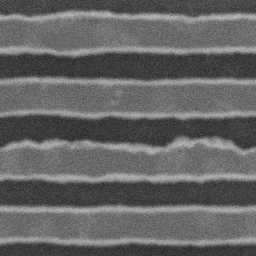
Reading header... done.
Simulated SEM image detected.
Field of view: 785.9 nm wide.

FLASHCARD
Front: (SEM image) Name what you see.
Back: one or a few lines or trenches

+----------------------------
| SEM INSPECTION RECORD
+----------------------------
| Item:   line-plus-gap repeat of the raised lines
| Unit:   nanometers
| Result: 196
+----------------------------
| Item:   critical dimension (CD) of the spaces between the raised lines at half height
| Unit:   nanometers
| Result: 88.7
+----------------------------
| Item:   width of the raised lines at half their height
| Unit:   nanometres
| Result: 108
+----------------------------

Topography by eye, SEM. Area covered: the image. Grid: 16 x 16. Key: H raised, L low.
LLLLLLLLLLLLLLLL
HHHHHHHHHHHHHHHH
HHHHHHHHHHHHHHHH
LLLLLLLLLLLLLLLL
LLLLLLLLLLLLLLLL
HHHHHHHHHHHHHHHH
HHHHHHHHHHHHHHHH
LLLLLLLLLLLLLLLL
LLLLLLLLLLLLLLLL
HHHHHHHHHHHHHHHH
HHHHHHHHHHHHHHHH
LLLLLLLLLLLLLLLL
LLLLLLLLLLLLLLLL
HHHHHHHHHHHHHHHH
HHHHHHHHHHHHHHHH
LLLLLLLLLLLLLLLL